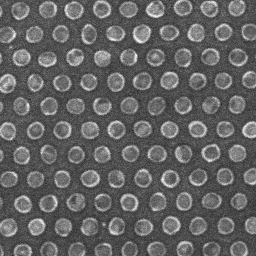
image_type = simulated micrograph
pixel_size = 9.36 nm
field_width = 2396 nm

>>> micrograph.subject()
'a regular array of raised bodies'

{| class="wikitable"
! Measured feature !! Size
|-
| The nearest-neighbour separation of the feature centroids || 248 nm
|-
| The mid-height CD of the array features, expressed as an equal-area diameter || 0.15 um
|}